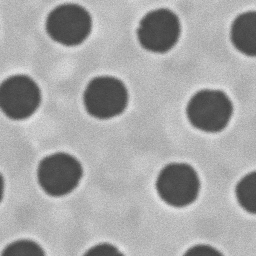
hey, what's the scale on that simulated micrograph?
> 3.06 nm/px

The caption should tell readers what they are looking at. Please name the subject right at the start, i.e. holes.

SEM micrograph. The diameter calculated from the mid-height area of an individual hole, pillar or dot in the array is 138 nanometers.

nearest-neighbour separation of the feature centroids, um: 0.25